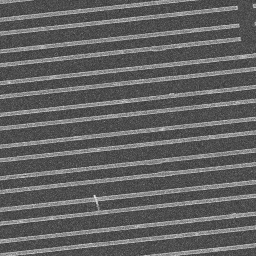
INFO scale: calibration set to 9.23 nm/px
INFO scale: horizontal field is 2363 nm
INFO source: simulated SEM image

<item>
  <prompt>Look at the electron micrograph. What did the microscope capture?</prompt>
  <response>parallel lines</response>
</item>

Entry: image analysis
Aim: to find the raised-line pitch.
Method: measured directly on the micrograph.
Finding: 15.7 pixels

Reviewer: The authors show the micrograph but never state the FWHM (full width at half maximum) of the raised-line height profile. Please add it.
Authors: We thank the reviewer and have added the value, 0.0355 microns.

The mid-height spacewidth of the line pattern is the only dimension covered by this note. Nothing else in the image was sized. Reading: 94.1 nm